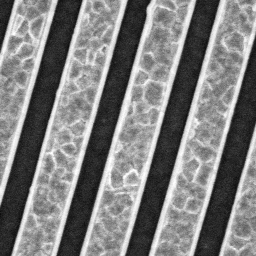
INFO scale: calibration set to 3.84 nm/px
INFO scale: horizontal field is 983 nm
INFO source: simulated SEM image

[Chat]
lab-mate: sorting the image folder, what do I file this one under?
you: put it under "one or a few lines or trenches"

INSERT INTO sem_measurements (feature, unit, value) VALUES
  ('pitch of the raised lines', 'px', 66.4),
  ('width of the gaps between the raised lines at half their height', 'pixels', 27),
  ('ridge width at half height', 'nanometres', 153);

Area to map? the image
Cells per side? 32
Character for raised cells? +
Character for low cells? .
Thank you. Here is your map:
..+++++...++++++...+++++....++++
..+++++...+++++....+++++...+++++
.+++++....+++++...++++++...+++++
.+++++....+++++...+++++....+++++
.+++++...+++++....+++++....+++++
.++++....+++++....+++++...+++++.
+++++....+++++...+++++....+++++.
+++++...++++++...+++++....+++++.
+++++...+++++....+++++...+++++..
++++....+++++....+++++...+++++..
++++....+++++...+++++....+++++..
++++...++++++...+++++....+++++..
+++....+++++....+++++...+++++...
+++....+++++...++++++...+++++...
+++....+++++...+++++....+++++...
+++...+++++....+++++....++++....
++....+++++....+++++...+++++....
++....+++++...+++++....+++++....
++...++++++...+++++....+++++...+
+....+++++....+++++...+++++....+
+....+++++....+++++...+++++....+
+....+++++...+++++....+++++...++
+...+++++....+++++....+++++...++
....+++++....+++++...+++++....++
....+++++...+++++....+++++....++
...++++++...+++++....+++++...+++
...+++++....+++++...++++++...+++
...+++++....+++++...+++++....+++
...+++++...+++++....+++++...++++
..+++++....+++++....+++++...++++
..+++++....+++++...+++++....++++
..+++++...+++++....+++++....++++